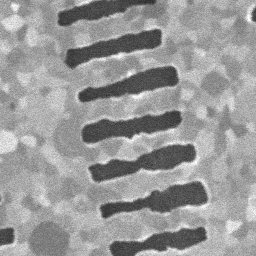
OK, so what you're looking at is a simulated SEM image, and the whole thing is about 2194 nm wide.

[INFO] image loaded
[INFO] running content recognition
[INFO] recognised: holes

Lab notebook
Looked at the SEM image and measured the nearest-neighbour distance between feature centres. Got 41.3 pixels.